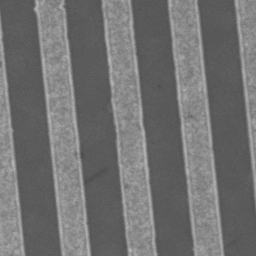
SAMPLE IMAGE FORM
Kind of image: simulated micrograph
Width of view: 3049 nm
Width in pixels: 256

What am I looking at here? one or a few lines or trenches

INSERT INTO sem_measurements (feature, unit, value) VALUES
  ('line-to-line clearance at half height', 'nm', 478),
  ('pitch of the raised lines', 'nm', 786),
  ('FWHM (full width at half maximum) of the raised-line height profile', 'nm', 306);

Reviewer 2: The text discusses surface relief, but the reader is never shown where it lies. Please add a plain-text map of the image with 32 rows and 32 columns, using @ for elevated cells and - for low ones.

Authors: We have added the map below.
-----@@@-----@@@-----@@@------@@
-----@@@-----@@@-----@@@@-----@@
-----@@@-----@@@-----@@@@-----@@
-----@@@-----@@@------@@@-----@@
-----@@@-----@@@@-----@@@-----@@
-----@@@-----@@@@-----@@@-----@@
-----@@@@-----@@@-----@@@-----@@
-----@@@@-----@@@-----@@@-----@@
------@@@-----@@@-----@@@-----@@
@-----@@@-----@@@-----@@@------@
@-----@@@-----@@@-----@@@------@
@-----@@@-----@@@-----@@@@-----@
@-----@@@-----@@@-----@@@@-----@
@-----@@@-----@@@@-----@@@-----@
@-----@@@-----@@@@-----@@@-----@
@-----@@@------@@@-----@@@-----@
@-----@@@@-----@@@-----@@@-----@
@-----@@@@-----@@@-----@@@-----@
@@-----@@@-----@@@-----@@@------
@@-----@@@-----@@@-----@@@@-----
@@-----@@@-----@@@-----@@@@-----
@@-----@@@-----@@@-----@@@@-----
@@-----@@@-----@@@------@@@-----
@@-----@@@-----@@@@-----@@@-----
@@-----@@@-----@@@@-----@@@-----
@@-----@@@------@@@-----@@@-----
@@-----@@@@-----@@@-----@@@-----
@@------@@@-----@@@-----@@@-----
@@@-----@@@-----@@@-----@@@-----
@@@-----@@@-----@@@-----@@@-----
@@@-----@@@-----@@@-----@@@@----
@@@-----@@@-----@@@-----@@@@----